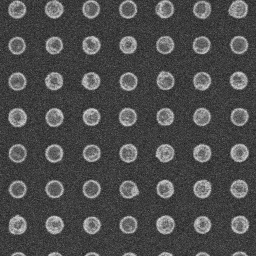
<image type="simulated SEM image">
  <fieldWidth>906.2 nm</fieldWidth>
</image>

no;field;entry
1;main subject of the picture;a regular array of raised bodies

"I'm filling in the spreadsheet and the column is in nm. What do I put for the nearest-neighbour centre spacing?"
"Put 126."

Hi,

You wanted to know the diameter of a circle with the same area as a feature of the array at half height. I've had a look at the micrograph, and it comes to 58.8 nm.